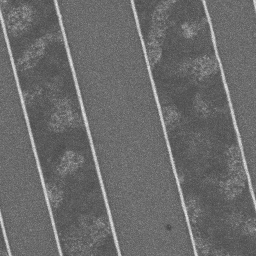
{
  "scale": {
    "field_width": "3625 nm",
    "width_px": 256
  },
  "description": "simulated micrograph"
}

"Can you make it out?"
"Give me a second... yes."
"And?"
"one or a few lines or trenches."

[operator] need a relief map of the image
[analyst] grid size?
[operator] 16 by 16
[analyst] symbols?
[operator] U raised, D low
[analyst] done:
UUUUDDDDUUUUUDDD
UUUUDDDDDUUUUDDD
UUUUDDDDDUUUUDDD
DUUUDDDDDUUUUUDD
DUUUUDDDDUUUUUDD
DUUUUDDDDDUUUUDD
DUUUUDDDDDUUUUDD
DDUUUDDDDDUUUUUD
DDUUUUDDDDUUUUUD
DDUUUUDDDDDUUUUD
DDUUUUDDDDDUUUUD
DDDUUUDDDDDUUUUU
DDDUUUUDDDDUUUUU
DDDUUUUDDDDDUUUU
DDDUUUUDDDDDUUUU
DDDDUUUDDDDDUUUU